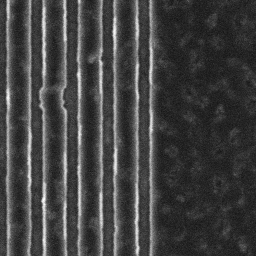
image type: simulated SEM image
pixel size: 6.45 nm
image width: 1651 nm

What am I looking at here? parallel lines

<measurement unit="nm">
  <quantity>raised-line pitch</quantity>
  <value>230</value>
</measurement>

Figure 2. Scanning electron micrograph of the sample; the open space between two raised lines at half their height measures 77.3 nanometres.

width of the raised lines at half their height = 149 nm